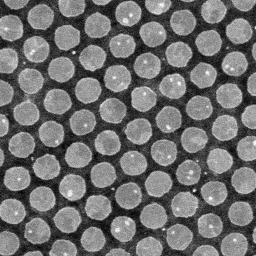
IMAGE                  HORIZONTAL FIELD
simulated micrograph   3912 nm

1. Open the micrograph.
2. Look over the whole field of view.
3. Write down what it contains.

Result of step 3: a regular array of raised bodies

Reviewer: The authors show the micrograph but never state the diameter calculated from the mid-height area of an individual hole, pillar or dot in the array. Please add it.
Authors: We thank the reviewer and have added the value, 382 nm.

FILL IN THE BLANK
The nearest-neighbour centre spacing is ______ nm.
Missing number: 491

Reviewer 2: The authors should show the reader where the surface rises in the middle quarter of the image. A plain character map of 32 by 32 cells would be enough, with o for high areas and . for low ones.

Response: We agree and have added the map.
oo...oooo.....o...oooooo....oo..
oo....oo...ooooo..oooooo........
oo........oooooo..ooooo.........
oo........ooooooo....o...ooooo..
....ooooo.oooooo........oooooo..
...oooooo..ooooo........oooooo..
...oooooo...ooo...oooo.ooooooo..
o..oooooo........ooooooo.ooooo..
o..ooooo.........oooooo....o....
oo...oo...oooo...oooooo........o
oo.......oooooo..ooooo.........o
o........oooooo....oo....ooo...o
...oooo..oooooo.........ooooo..o
..oooooo..ooooo........oooooo...
..oooooo....oo...oooo..oooooo...
..oooooo........ooooo..oooooo...
..ooooo.........oooooo..oooo..oo
...oo....oooo..ooooooo........oo
........oooooo..ooooo........ooo
........oooooo...ooo...oooo..ooo
..oooo..oooooo........oooooo..oo
.ooooo..oooooo........oooooo..oo
ooooooo...oo...oooo...oooooo....
ooooooo.......oooooo..oooooo....
.ooooo........ooooooo..oooo...oo
..ooo...oooo..ooooooo........ooo
.......oooooo..ooooo........oooo
.......oooooo...ooo...oooo..oooo
oooo...oooooo........ooooo..oooo
ooooo..ooooo........ooooooo..ooo
ooooo...ooo...oooo..ooooooo.....
ooooo........oooooo..ooooo......